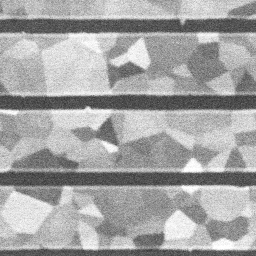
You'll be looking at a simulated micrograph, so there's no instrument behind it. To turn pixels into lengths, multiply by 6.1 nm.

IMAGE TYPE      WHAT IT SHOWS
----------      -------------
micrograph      one or a few lines or trenches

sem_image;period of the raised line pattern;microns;0.468